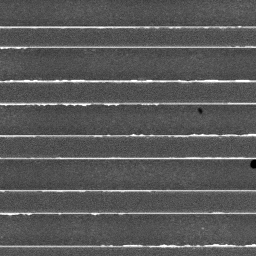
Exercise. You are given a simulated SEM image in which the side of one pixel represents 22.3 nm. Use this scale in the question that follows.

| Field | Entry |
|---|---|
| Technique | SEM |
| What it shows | lines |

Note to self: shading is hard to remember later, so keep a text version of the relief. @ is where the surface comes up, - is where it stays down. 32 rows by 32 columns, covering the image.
--------------------------------
--------------------------------
--------------------------------
@@@@@@@@@@@@@@@@@@@@@@@@@@@@@@@@
@@@@@@@@@@@@@@@@@@@@@@@@@@@@@@@@
@@@@@@@@@@@@@@@@@@@@@@@@@@@@@@@@
--------------------------------
--------------------------------
--------------------------------
--------------------------------
@@@@@@@@@@@@@@@@@@@@@@@@@@@@@@@@
@@@@@@@@@@@@@@@@@@@@@@@@@@@@@@@@
@@@@@@@@@@@@@@@@@@@@@@@@@@@@@@@@
--------------------------------
--------------------------------
--------------------------------
--------------------------------
@@@@@@@@@@@@@@@@@@@@@@@@@@@@@@@@
@@@@@@@@@@@@@@@@@@@@@@@@@@@@@@@@
@@@@@@@@@@@@@@@@@@@@@@@@@@@@@@@@
--------------------------------
--------------------------------
--------------------------------
--------------------------------
@@@@@@@@@@@@@@@@@@@@@@@@@@@@@@@@
@@@@@@@@@@@@@@@@@@@@@@@@@@@@@@@@
@@@@@@@@@@@@@@@@@@@@@@@@@@@@@@@@
--------------------------------
--------------------------------
--------------------------------
--------------------------------
@@@@@@@@@@@@@@@@@@@@@@@@@@@@@@@@